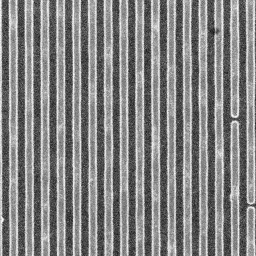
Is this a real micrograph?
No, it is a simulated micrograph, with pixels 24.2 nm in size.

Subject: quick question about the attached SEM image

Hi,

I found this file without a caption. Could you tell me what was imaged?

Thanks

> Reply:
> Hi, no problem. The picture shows parallel lines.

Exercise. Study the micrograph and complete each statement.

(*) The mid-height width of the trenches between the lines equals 214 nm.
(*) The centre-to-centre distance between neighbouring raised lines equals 382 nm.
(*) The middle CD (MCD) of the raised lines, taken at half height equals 166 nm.